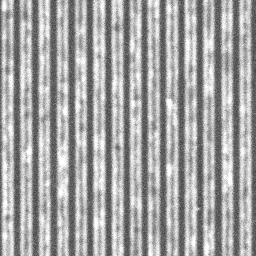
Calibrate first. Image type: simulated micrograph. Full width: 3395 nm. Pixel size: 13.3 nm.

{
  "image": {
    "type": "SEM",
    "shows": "parallel lines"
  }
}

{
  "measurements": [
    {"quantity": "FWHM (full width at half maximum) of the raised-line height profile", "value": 109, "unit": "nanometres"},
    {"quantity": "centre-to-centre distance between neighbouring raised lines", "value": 242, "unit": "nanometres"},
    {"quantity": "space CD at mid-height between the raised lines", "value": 134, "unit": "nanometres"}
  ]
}